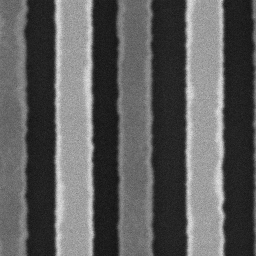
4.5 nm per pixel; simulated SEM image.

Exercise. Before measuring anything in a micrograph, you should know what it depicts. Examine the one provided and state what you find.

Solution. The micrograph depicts lines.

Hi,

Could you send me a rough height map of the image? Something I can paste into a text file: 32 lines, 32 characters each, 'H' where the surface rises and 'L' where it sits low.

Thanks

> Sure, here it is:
HHHLLLLHHHHLLLLHHHHLLLLLHHHHLLLL
HHHLLLLHHHHLLLLHHHHLLLLHHHHHLLLL
HHHLLLLHHHHLLLLHHHHLLLLHHHHHLLLL
HHHLLLLHHHHLLLLHHHHLLLLHHHHHLLLL
HHHLLLLHHHHLLLLHHHHLLLLHHHHHLLLL
HHHLLLLHHHHLLLLHHHHLLLLHHHHHLLLL
HHHLLLLHHHHLLLLHHHHLLLLHHHHHLLLL
HHHLLLLHHHHLLLLHHHHLLLLHHHHHLLLL
HHHLLLLHHHHLLLLHHHHLLLLHHHHHLLLL
HHHLLLLHHHHLLLLHHHHLLLLHHHHHLLLL
HHHLLLLHHHHLLLLHHHHLLLLHHHHHLLLL
HHHLLLLHHHHLLLLHHHHLLLLHHHHHLLLL
HHHLLLLHHHHLLLLHHHHLLLLHHHHHLLLL
HHHLLLLHHHHLLLLHHHHLLLLHHHHHLLLL
HHHLLLLHHHHLLLLHHHHLLLLHHHHHLLLL
HHHLLLLHHHHLLLLHHHHLLLLLHHHHLLLL
HHHLLLLHHHHHLLLHHHHLLLLHHHHHLLLL
HHHLLLLHHHHLLLLHHHHLLLLHHHHHLLLL
HHHLLLLHHHHHLLLHHHHLLLLHHHHHLLLL
HHHLLLLHHHHLLLLHHHHLLLLHHHHHLLLL
HHHLLLLHHHHLLLLHHHHLLLLHHHHHLLLL
HHHLLLLHHHHHLLLHHHHLLLLLHHHHLLLL
HHHLLLLHHHHLLLLHHHHLLLLHHHHHLLLL
HHHLLLLHHHHHLLLHHHHLLLLHHHHHLLLL
HHHLLLLHHHHHLLLHHHHLLLLHHHHHLLLL
HHHLLLLHHHHHLLLHHHHLLLLHHHHHLLLL
HHHLLLLHHHHHLLLHHHHLLLLHHHHHLLLL
HHHLLLLHHHHHLLLHHHHLLLLLHHHHLLLL
HHHLLLLHHHHHLLLHHHHLLLLLHHHHLLLL
HHHLLLLHHHHHLLLHHHHLLLLLHHHHLLLL
HHHLLLLHHHHHLLLHHHHLLLLLHHHHLLLL
HHHLLLLHHHHHLLLHHHHLLLLLHHHHLLLL